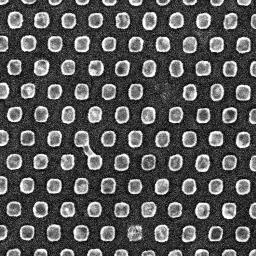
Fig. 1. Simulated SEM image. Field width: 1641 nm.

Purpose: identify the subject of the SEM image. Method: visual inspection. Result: a regular array of raised bodies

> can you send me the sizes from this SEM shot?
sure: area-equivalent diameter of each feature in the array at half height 93.3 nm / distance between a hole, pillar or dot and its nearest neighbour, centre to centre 171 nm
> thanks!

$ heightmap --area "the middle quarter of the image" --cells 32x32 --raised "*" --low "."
***....**....***....***....**...
***...***....***....***....***..
**.....**....***....***....***..
................................
................................
...***....**.....**............*
...***....***....**...........**
...***....***....**...........**
...**.....**.....**...........**
................................
................................
**....***....***....**.....**...
***...***....***...****...****..
**....***....***...****...****..
**..................**.....**...
................................
................................
...***....***....**....***....**
...***....***...***....***....**
...***....***...***....***....**
.................**....**.......
................................
................................
**....***....***....***....**...
**....***....***....***....**...
**....***....***....***....**...
................................
................................
................................
...***....***...***....***....**
...***...****...***....***....**
...***...****...***....***....**